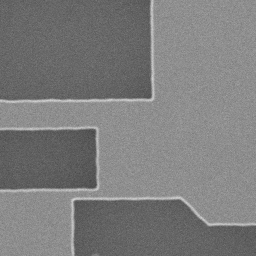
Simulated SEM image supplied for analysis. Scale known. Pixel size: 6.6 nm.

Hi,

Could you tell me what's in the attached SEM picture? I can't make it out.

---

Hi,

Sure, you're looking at groups of lines, slits or small figures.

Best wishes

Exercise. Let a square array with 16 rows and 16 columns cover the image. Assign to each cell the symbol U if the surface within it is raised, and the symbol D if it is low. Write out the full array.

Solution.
DDDDDDDDDUUUUUUU
DDDDDDDDDDUUUUUU
DDDDDDDDDDUUUUUU
DDDDDDDDDDUUUUUU
DDDDDDDDDDUUUUUU
DDDDDDDDDDUUUUUU
UUUUUUUUUUUUUUUU
UUUUUUUUUUUUUUUU
DDDDDDUUUUUUUUUU
DDDDDDUUUUUUUUUU
DDDDDDUUUUUUUUUU
DDDDDDUUUUUUUUUU
UUUUUDDDDDDUUUUU
UUUUUDDDDDDDUUUU
UUUUUDDDDDDDDDDD
UUUUUDDDDDDDDDDD